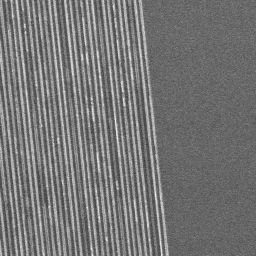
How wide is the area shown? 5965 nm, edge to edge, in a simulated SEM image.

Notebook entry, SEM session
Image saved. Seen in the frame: parallel lines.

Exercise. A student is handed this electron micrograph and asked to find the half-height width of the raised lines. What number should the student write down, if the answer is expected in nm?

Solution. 23.2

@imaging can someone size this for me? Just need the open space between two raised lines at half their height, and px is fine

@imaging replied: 3.73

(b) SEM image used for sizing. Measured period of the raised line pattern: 124 nanometers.